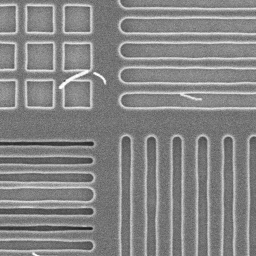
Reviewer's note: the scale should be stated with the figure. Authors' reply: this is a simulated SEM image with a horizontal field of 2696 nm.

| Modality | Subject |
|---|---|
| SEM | groups of lines, slits or small figures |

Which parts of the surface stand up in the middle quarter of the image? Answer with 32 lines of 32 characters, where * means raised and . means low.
.......*************************
......*********.................
**************..................
**************..................
*.....*********.................
.......*************************
.......*************************
.......*********................
.......*******..................
.......*******..................
.......********.................
********************************
********************************
********************************
********************************
********************************
********************************
********************************
***************..****..****..***
.......*******...****..****..***
.......*******...***...****...**
**************...***...****...**
**************...****..****...**
.......*******...****..****...**
.......*******...****..****..***
**************...****..****..***
**************...****..****...**
.......*******...****..****...**
........******...***...****..***
.......*******...***...****..***
**************...***...****..***
.......*******...****..****..***